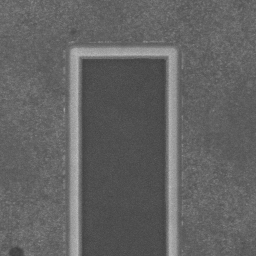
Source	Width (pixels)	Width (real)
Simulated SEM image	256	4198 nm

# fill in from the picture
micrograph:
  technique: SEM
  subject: one or a few lines or trenches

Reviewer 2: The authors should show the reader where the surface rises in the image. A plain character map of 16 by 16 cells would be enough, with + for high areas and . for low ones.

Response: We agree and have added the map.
++++++++++++++++
++++++++++++++++
++++++++++++++++
+++++......+++++
+++++......+++++
+++++......+++++
+++++......+++++
+++++......+++++
+++++......+++++
+++++......+++++
+++++......+++++
+++++......+++++
+++++......+++++
+++++......+++++
+++++......+++++
+++++......+++++